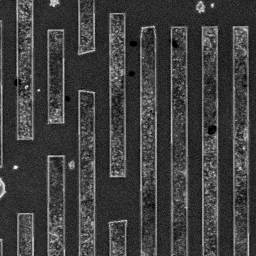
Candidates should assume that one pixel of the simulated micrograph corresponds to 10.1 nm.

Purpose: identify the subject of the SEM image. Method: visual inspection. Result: wiring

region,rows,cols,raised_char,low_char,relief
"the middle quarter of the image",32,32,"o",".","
............ooo....oooo....oooo.
............ooo....oooo....oooo.
............ooo....oooo....oooo.
............ooo....oooo....oooo.
............ooo....oooo....oooo.
............ooo....oooo....oooo.
............ooo....oooo....oooo.
....oooo....ooo....oooo....oooo.
....oooo....ooo....oooo....oooo.
....oooo....ooo....oooo....oooo.
....oooo....ooo....oooo....oooo.
....oooo....ooo....oooo....oooo.
....oooo....ooo....oooo....oooo.
....oooo....ooo....oooo....oooo.
....oooo....ooo....oooo....oooo.
....oooo....ooo....oooo....oooo.
....oooo....ooo....oooo....oooo.
....oooo....ooo....oooo....oooo.
....oooo....ooo....oooo....oooo.
....oooo....ooo....oooo....oooo.
....oooo....ooo....oooo....oooo.
....oooo....ooo....oooo....oooo.
....oooo....ooo....oooo....oooo.
....oooo....ooo....oooo....oooo.
....oooo....ooo....oooo....oooo.
....oooo....ooo....oooo....oooo.
....oooo....ooo....oooo....oooo.
....oooo....ooo....oooo....oooo.
....oooo...........oooo....oooo.
....oooo...........oooo....oooo.
....oooo...........oooo....oooo.
....oooo...........oooo....oooo.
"